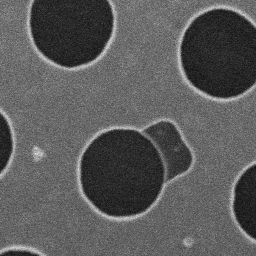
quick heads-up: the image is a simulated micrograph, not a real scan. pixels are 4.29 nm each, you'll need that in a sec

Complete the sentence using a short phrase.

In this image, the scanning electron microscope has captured holes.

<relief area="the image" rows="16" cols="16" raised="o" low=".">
oo.....ooooooooo
oo.....ooooo....
oo.....oooo.....
ooo...ooooo.....
ooooooooooo.....
oooooooooooo....
oooooooooooooooo
oooooooooooooooo
.ooooo.....ooooo
.oooo.......oooo
ooooo.......oooo
ooooo.....ooooo.
oooooo....ooooo.
ooooooo.ooooooo.
ooooooooooooooo.
oooooooooooooooo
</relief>